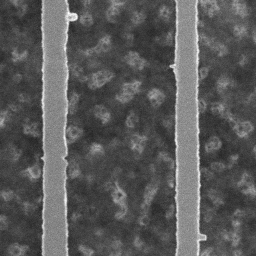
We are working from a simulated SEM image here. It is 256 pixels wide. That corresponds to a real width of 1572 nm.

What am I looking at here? one or a few lines or trenches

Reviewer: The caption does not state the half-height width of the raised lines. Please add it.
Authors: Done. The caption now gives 0.141 µm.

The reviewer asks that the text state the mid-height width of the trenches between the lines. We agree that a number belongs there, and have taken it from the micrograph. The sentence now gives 673 nanometres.